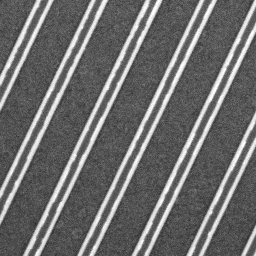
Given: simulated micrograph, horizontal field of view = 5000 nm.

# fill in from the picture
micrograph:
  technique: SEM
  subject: parallel lines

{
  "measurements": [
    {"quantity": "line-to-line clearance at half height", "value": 739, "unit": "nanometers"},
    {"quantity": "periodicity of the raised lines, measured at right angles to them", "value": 959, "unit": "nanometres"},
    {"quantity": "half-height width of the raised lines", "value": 0.222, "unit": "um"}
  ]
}